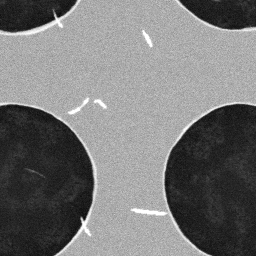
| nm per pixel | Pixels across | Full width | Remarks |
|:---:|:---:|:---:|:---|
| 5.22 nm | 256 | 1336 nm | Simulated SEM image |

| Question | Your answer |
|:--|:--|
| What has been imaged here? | holes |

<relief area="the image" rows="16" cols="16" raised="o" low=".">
.....ooooooo....
...oooooooooo...
oooooooooooooooo
oooooooooooooooo
oooooooooooooooo
oooooooooooooooo
oooooooooooooooo
....oooooooo....
.....oooooo.....
.....oooooo.....
......oooo......
......oooo......
......oooo......
.....oooooo.....
.....oooooo.....
....oooooooo....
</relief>